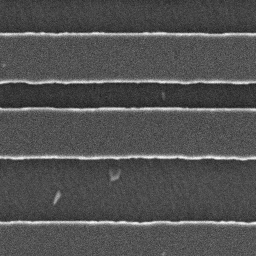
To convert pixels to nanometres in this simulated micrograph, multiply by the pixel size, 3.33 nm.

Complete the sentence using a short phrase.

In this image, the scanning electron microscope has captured lines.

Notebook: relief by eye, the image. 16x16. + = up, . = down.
................
................
++++++++++++++++
++++++++++++++++
++++++++++++++++
................
................
++++++++++++++++
++++++++++++++++
++++++++++++++++
................
................
................
................
++++++++++++++++
++++++++++++++++